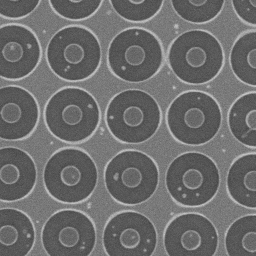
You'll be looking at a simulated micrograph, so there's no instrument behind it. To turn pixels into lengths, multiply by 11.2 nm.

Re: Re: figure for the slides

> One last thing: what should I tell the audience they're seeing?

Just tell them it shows an array of small figures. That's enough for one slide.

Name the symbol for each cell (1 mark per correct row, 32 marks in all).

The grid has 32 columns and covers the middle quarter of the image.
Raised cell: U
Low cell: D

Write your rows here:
DDDDDDDDDUUDDDDDDDDDDDDDUUUDDDDD
DDDDDDDDUUUUDDDDDDDDDDDDUUUDDDDD
DDDDDDDUUUUUDDDDDDDDDDDUUUUUDDDD
DDDDDDUUUUUUUUDDDDDDDUUUUUUUUDDD
UUUUUUUUUUUUUUUUUDDUUUUUUUUUUUDD
UUUUUUUUUUUUUUUUUUUUUUUUUUUUUUUU
DDDDDUUUUUUUUUUUDDUUUUUUUUUUUUUU
DDDDDDDUUUUUUUDDDDDDDUUUUUUUUDDD
DDDDDDDUUUUUDDDDDDDDDDUUUUUUDDDD
DDDDDDDDUUUUDDDDDDDDDDDUUUUDDDDD
DDUDDDDDDUUDDDDDDDDDDDDDUUUDDDDD
UUUUDDDDDUUDDDDUUUUDDDDDUUDDDDDU
UUUUDDDDDUDDDDDUUUUUDDDDUUDDDDUU
UUUUDDDDDUDDDDDUUUUUDDDDUUDDDDUU
UUUUDDDDDUUDDDDUUUUDDDDDUUDDDDUU
DDDDDDDDUUUDDDDDDDDDDDDDUUDDDDDU
DDDDDDDDUUUDDDDDDDDDDDDUUUDDDDDD
DDDDDDDUUUUUDDDDDDDDDDUUUUUDDDDD
DDDDDDUUUUUUUDDDDDDDDUUUUUUUDDDD
UDDDUUUUUUUUUUUDDDDDUUUUUUUUUDDD
UUUUUUUUUUUUUUUUUUUUUUUUUUUUUUUU
DDDDUUUUUUUUUUUDDUUUUUUUUUUUUUUU
DDDDDDUUUUUUUDDDDDDDUUUUUUUUUUDD
DDDDDDDUUUUUDDDDDDDDDDUUUUUUDDDD
DDDDDDDUUUUDDDDDDDDDDDDUUUUDDDDD
DDDDDDDDUUUDDDDDDDDDDDDUUUDDDDDD
UUUUDDDDUUDDDDDUUUDDDDDUUUDDDDDD
UUUUDDDDUUDDDDDUUUUDDDDDUUDDDDUU
UUUUDDDDUUDDDDDUUUUDDDDDUDDDDDUU
UUUDDDDDUUDDDDDUUUUDDDDDUUDDDDUU
DDDDDDDDUUDDDDDDUUDDDDDUUUDDDDUU
DDDDDDDUUUUDDDDDDDDDDDDUUUDDDDDD